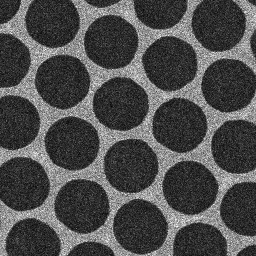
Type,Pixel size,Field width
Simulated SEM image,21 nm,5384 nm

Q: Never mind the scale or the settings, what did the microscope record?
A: a regular array of holes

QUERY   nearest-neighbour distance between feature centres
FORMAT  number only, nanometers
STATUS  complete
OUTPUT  1310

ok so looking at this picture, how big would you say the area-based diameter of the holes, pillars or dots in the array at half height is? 1160 nm